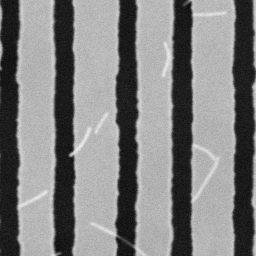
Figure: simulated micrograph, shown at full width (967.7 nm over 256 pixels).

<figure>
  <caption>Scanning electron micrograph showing lines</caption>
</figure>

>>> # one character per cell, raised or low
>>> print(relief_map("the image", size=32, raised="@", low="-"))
--@@@@@--@@@@@@--@@@@@--@@@@@---
--@@@@@--@@@@@@--@@@@@--@@@@@---
--@@@@@--@@@@@@--@@@@@--@@@@@---
--@@@@@--@@@@@@--@@@@@--@@@@@---
--@@@@@--@@@@@@--@@@@@--@@@@@---
--@@@@@--@@@@@@--@@@@@--@@@@@---
--@@@@@--@@@@@@--@@@@@--@@@@@---
--@@@@@--@@@@@@--@@@@@--@@@@@---
--@@@@@--@@@@@@--@@@@@--@@@@@---
--@@@@@--@@@@@@--@@@@@--@@@@@---
--@@@@@--@@@@@---@@@@@--@@@@@---
--@@@@@--@@@@@---@@@@---@@@@@---
--@@@@@--@@@@@---@@@@---@@@@@---
--@@@@@--@@@@@---@@@@@--@@@@@---
--@@@@@--@@@@@---@@@@---@@@@@---
--@@@@@--@@@@@@--@@@@@--@@@@@---
--@@@@@--@@@@@@--@@@@---@@@@@---
--@@@@@--@@@@@@--@@@@@--@@@@@---
--@@@@@--@@@@@@--@@@@@--@@@@@---
--@@@@@--@@@@@@--@@@@@--@@@@@---
--@@@@@--@@@@@@--@@@@@--@@@@@---
--@@@@@--@@@@@@--@@@@@--@@@@@---
--@@@@@--@@@@@@--@@@@@--@@@@@---
--@@@@@--@@@@@@--@@@@---@@@@@---
--@@@@@--@@@@@@--@@@@---@@@@@---
--@@@@@--@@@@@@--@@@@@--@@@@@--@
--@@@@@--@@@@@@--@@@@@--@@@@@---
--@@@@@--@@@@@---@@@@@--@@@@@---
--@@@@@--@@@@@---@@@@@--@@@@@---
--@@@@@--@@@@@@--@@@@@--@@@@@---
--@@@@@--@@@@@@--@@@@@--@@@@@---
---@@@@--@@@@@@--@@@@---@@@@@---